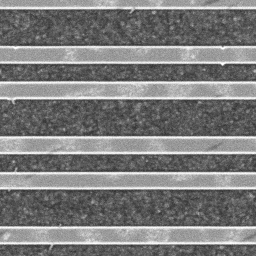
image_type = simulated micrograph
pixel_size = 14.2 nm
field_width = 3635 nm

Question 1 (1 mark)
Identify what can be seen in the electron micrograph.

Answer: parallel lines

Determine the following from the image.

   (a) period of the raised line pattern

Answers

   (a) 638 nm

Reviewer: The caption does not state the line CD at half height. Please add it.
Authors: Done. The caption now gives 236 nm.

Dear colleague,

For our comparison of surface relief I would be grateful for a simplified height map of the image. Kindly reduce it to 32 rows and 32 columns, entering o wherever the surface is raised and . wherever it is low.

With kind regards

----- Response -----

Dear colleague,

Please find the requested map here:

oooooooooooooooooooooooooooooooo
................................
..o.............................
................o...............
................................
................................
oooooooooooooooooooooooooooooooo
oooooooooooooooooooooooooooooooo
................................
................................
oooooooooooooooooooooooooooooooo
oooooooooooooooooooooooooooooooo
................................
................................
................................
................................
................................
oooooooooooooooooooooooooooooooo
oooooooooooooooooooooooooooooooo
................................
................................
................................
oooooooooooooooooooooooooooooooo
oooooooooooooooooooooooooooooooo
................................
................................
................................
................................
oooooooooooooooooooooooooooooooo
oooooooooooooooooooooooooooooooo
......o....................o....
................................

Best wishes